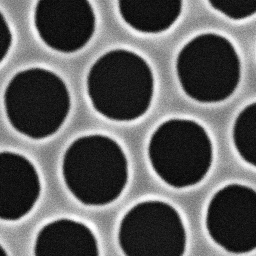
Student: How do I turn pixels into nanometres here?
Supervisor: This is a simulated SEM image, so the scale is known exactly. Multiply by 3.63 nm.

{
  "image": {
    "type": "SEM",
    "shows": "holes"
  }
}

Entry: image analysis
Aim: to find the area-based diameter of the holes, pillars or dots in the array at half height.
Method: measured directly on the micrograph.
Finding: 251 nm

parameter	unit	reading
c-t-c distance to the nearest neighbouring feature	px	87.3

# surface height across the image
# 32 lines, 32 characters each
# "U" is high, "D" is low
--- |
UUUUUDDDDDDUUUUDDDDDDDDUUUDDDDDD
UUUUDDDDDDDDUUUDDDDDDDDUUUUDDDDD
DUUUDDDDDDDDUUUDDDDDDDUUUUUUUDUU
DUUUDDDDDDDDUUUUUDDDDUUUUUUUUUUU
DDUUUDDDDDDDUUUUUUUUUUUUUDDDUUUU
DUUUUUDDDDDUUUUUUUUUUUUDDDDDDUUU
DUUUUUUDDUUUUDDDDUUUUUDDDDDDDDUU
UUUUUUUUUUUUDDDDDDUUUUDDDDDDDDUU
UUUUDUUUUUUDDDDDDDDUUUDDDDDDDDUU
UUDDDDDUUUUDDDDDDDDUUUDDDDDDDDUU
UDDDDDDDUUUDDDDDDDDUUUUDDDDDDDUU
UDDDDDDDDUUDDDDDDDDUUUUDDDDDDUUU
DDDDDDDDDUUDDDDDDDDUUUUUDDDDUUUU
UDDDDDDDDUUUDDDDDDDUUUUUUUUUUUUD
UDDDDDDDUUUUUDDDDDUUUUUUUUUUUUDD
UDDDDDDDUUUUUUUUUUUUDDDDDUUUUDDD
UUDDDDDUUUUUUUUUUUUDDDDDDDUUUDDD
UUUUUUUUUDDDDDUUUUUDDDDDDDUUUDDD
UUUUUUUUDDDDDDDUUUDDDDDDDDDUUDDD
DDDUUUUUDDDDDDDDUUUDDDDDDDDUUUDD
DDDDUUUUDDDDDDDDUUUDDDDDDDUUUUUD
DDDDDUUUDDDDDDDDUUUDDDDDDDUUUUUU
DDDDDUUUDDDDDDDDUUUUDDDDDUUUUUUU
DDDDDUUUDDDDDDDDUUUUUUDUUUUUDDDU
DDDDDUUUUDDDDDDUUUUUUUUUUUUDDDDD
DDDDUUUUUUDDDDUUUDDDDUUUUUDDDDDD
DDDDUUUUUUUUUUUUDDDDDDUUUUDDDDDD
DDUUUUUDDUUUUUUDDDDDDDDUUUDDDDDD
UUUUUDDDDDDUUUUDDDDDDDDUUUDDDDDD
UUUUUDDDDDDDUUUDDDDDDDDUUUDDDDDD
UUUUDDDDDDDDUUUDDDDDDDDUUUUDDDDD
DUUUDDDDDDDDUUUDDDDDDDDUUUUUDDDU